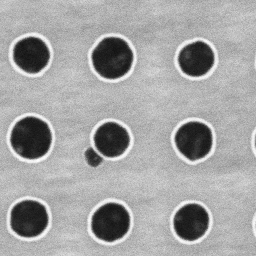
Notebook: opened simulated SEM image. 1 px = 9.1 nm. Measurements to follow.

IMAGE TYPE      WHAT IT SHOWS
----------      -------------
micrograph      a regular array of raised bodies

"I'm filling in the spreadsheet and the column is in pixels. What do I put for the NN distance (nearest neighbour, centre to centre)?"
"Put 80.5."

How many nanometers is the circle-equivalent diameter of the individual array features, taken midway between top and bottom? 390